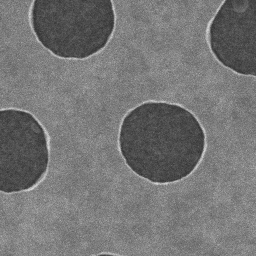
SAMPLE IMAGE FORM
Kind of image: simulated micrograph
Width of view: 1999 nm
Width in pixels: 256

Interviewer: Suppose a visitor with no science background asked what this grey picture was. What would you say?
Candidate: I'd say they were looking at holes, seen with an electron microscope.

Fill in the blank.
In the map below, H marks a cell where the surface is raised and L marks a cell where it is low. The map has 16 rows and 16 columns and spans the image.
HHLLLLLHHHHHHHLL
HHLLLLLHHHHHHLLL
HHLLLLLHHHHHHLLL
HHHHLLHHHHHHHLLL
HHHHHHHHHHHHHHHL
HHHHHHHHHHHHHHHH
HHHHHHHHHLLHHHHH
LLHHHHHHLLLLHHHH
LLLHHHHLLLLLLHHH
LLLHHHHHLLLLLHHH
LLLHHHHHLLLLHHHH
LLHHHHHHHHHHHHHH
HHHHHHHHHHHHHHHH
HHHHHHHHHHHHHHHH
HHHHHHHHHHHHHHHH
HHHHHHHHHHHHHHHH